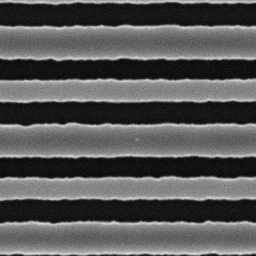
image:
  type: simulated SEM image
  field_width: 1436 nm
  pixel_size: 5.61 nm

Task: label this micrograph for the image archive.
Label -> lines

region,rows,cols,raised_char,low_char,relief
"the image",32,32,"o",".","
................................
................................
................................
oooooooooooooooooooooooooooooooo
oooooooooooooooooooooooooooooooo
oooooooooooooooooooooooooooooooo
oooooooooooooooooooooooooooooooo
.......o........................
................................
................................
oooooooooooooooooooooooooooooooo
oooooooooooooooooooooooooooooooo
oooooooooooooooooooooooooooooooo
................................
................................
........oo...........o..........
oooooooooooooooooooooooooooooooo
oooooooooooooooooooooooooooooooo
oooooooooooooooooooooooooooooooo
oooo.ooooo.oooo....oooo...ooooo.
................................
................................
oooooooooooooooooooooooooooooooo
oooooooooooooooooooooooooooooooo
oooooooooooooooooooooooooooooooo
................................
................................
................................
oooooooooooooooooooooooooooooooo
oooooooooooooooooooooooooooooooo
oooooooooooooooooooooooooooooooo
oooooooooooooooooooooooooooooooo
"